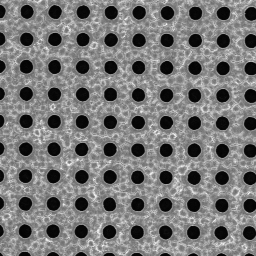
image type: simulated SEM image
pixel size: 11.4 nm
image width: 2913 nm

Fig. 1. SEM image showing a regular array of holes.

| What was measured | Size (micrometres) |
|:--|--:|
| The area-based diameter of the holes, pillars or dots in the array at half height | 0.155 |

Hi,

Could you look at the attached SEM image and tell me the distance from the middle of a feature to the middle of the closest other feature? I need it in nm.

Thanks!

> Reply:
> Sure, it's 310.